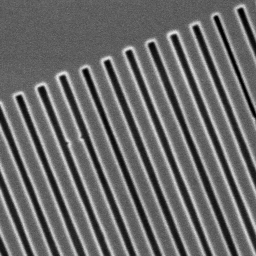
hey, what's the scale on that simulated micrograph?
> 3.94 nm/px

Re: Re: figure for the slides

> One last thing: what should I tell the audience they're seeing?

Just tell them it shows parallel lines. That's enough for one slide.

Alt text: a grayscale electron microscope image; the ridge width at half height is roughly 0.0631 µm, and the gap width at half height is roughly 27.9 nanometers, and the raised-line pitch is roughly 0.0931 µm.